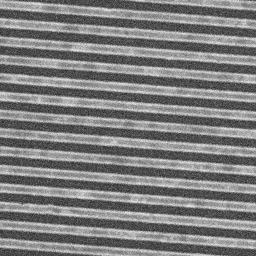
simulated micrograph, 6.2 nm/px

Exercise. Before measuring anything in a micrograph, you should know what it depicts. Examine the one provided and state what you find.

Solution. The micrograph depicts parallel lines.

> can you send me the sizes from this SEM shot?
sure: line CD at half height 43.2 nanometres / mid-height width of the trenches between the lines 70.2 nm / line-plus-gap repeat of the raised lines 113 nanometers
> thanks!